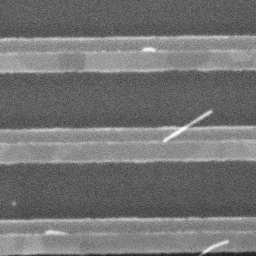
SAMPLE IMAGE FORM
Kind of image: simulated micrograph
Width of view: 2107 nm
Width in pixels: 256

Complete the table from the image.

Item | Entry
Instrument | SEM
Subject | lines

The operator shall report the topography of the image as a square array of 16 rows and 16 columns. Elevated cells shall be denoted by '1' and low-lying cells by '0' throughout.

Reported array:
0000000000000000
0000000000000000
1111111111111111
1111111111111111
0000000000000000
0000000000000000
0000000000000000
0000000000000000
1111111111111111
1111111111111111
0000000000000000
0000000000000000
0000000000000000
0000000000000000
1111111111111111
1111111111111111